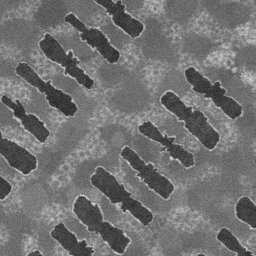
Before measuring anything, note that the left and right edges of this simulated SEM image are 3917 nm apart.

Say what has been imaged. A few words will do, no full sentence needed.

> a regular array of holes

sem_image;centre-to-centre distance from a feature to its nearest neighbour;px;34.8